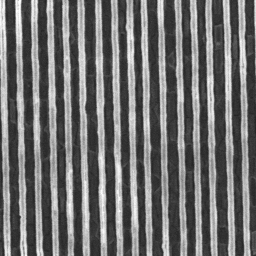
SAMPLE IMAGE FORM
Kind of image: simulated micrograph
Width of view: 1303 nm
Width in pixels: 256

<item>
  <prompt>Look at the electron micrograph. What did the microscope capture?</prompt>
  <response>parallel lines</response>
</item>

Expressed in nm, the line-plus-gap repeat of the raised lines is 81.3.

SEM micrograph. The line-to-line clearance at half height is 52.8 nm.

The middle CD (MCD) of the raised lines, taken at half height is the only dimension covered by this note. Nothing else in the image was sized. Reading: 26.7 nm